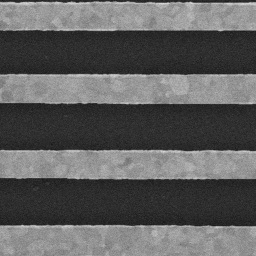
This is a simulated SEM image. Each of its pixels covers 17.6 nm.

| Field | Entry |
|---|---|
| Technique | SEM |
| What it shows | lines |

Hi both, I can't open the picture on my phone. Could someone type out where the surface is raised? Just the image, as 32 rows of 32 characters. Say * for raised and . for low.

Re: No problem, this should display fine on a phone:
********************************
********************************
********************************
********************************
................................
................................
................................
................................
................................
********************************
********************************
********************************
********************************
................................
................................
................................
................................
................................
................................
********************************
********************************
********************************
................................
................................
................................
................................
................................
................................
********************************
********************************
********************************
********************************